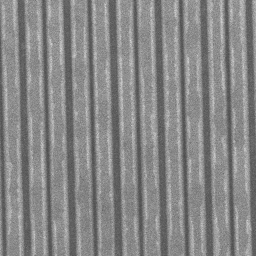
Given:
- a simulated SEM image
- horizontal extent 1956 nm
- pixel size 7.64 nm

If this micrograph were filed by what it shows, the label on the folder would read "parallel lines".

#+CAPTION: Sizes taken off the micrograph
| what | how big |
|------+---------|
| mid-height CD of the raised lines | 118 nanometres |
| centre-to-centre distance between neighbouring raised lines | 174 nanometres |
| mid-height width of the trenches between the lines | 65 nm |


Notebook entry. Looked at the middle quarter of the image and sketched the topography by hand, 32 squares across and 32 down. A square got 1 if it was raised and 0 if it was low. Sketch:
00111100111000111001111001111001
00011100111000111001111001111001
00011100111000111001111001111001
00011100111000111001111001111001
00011100111000111001111001111001
00011100111000111001111001111001
00011100111000111001111001111001
00011100111000111101111001111001
00011100111000111101111001111001
00011100111000111101111001111001
00011100111000111101111001111001
00011100111000111101111001111001
00011100111000111101111001111001
00011100111000111101111000111001
00011100111000111101111000111001
00011100111000111101111000111001
00011100111100111101111000111001
00011100111100111100111000111001
00011100111100111100111000111001
00011100111100111100111000111001
00011100111100111100111000111001
00011100111100111100111000111001
00011100111100111100111000111001
00011100111100011100111000111001
00011100111100011100111000111001
00011100111100011100111000111001
00011100111100011100111000111001
00011100111100011100111000111001
00011100111100011100111000111001
00011100111100011100111000111001
00011100111100011100111000111001
00011110111100011100111000111001